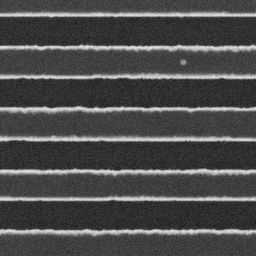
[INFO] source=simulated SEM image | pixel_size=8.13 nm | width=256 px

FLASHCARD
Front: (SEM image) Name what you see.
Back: lines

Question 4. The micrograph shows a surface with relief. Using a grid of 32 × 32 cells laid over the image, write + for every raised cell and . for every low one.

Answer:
++++++++++++++++++++++++++++++++
++++++++++++++++++++++++++++++++
................................
................................
................................
................................
++++++++++++++++++++++++++++++++
++++++++++++++++++++++++++++++++
++++++++++++++++++++++++++++++++
++++++++++++++++++++++++++++++++
................................
................................
................................
................................
++++++++++++++++++++++++++++++++
++++++++++++++++++++++++++++++++
++++++++++++++++++++++++++++++++
.....+...+.++..+++.++++.+++..+++
................................
................................
................................
++++++++++++++++++++++++++++++++
++++++++++++++++++++++++++++++++
++++++++++++++++++++++++++++++++
++++++++++++++++++++++++++++++++
................................
................................
................................
................................
++++++++++++++++++++++++++++++++
++++++++++++++++++++++++++++++++
++++++++++++++++++++++++++++++++